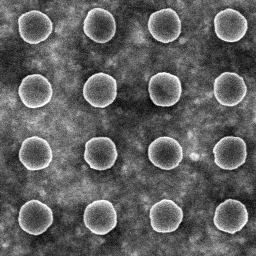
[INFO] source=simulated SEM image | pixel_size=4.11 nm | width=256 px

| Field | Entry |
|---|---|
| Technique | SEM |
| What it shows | a regular array of raised bodies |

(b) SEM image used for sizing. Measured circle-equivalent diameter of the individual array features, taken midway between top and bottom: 135 nm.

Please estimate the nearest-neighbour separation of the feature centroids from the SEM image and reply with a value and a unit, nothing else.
0.261 µm